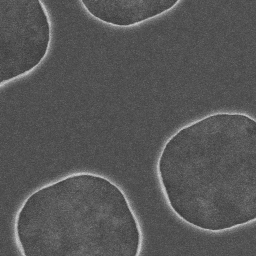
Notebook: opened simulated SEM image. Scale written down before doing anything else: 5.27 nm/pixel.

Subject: holes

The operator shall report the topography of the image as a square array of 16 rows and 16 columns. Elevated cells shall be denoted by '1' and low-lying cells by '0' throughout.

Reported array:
0001100000011111
0001111011111111
0001111111111111
0001111111111111
0011111111111111
1111111111111111
1111111111111111
1111111111111000
1111111111100000
1111111111000000
1111111111000000
1110000111000000
1100000011100000
1000000011100000
1000000001111111
1000000001111111